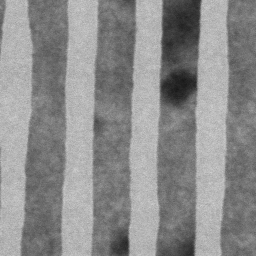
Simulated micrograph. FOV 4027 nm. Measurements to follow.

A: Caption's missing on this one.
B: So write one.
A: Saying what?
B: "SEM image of one or a few lines or trenches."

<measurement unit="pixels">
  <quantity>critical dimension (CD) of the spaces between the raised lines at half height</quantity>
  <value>38.2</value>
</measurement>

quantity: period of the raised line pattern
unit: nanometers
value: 1030